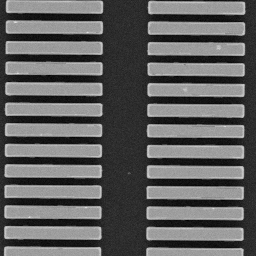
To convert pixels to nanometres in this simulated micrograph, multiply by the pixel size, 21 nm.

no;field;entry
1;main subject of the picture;groups of lines, slits or small figures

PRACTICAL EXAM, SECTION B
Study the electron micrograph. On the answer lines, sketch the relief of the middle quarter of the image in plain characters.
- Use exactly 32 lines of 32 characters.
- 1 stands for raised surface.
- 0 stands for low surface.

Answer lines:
11111111100000000000011111111111
11111111100000000000011111111111
11111111100000000000011111111111
00000000000000000000000000000000
00000000000000000000000000000000
11111111100000000000011111111111
11111111100000000000011111111111
11111111100000000000011111111111
00000000000000000000000000000000
00000000000000000000000000000000
11111111100000000000011111111111
11111111100000000000011111111111
11111111100000000000011111111111
00000000000000000000000000000000
00000000000000000000000000000000
11111111100000000000011111111111
11111111100000000000011111111111
11111111100000000000011111111111
00000000000000000000000000000000
00000000000000000000000000000000
11111111100000000000011111111111
11111111100000000000011111111111
11111111100000000000011111111111
00000000000000000000000000000000
00000000000000000000000000000000
11111111100000000000011110000000
11111111100000000000011111111111
11111111100000000000011111111111
00000000000000000000000000000000
00000000000000000000000000000000
00000000000000000000000000000000
11111111100000000000011111111111